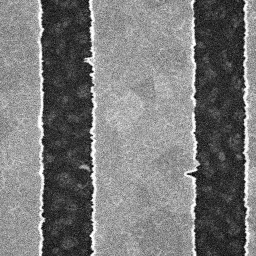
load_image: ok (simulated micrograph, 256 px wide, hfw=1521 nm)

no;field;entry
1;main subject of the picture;one or a few lines or trenches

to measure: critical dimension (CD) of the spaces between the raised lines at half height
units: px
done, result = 50.5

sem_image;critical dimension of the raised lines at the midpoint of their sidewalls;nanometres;608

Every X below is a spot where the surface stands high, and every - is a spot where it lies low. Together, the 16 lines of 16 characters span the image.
XXX---XXXXXX---X
XXX---XXXXXX---X
XXX---XXXXXX---X
XXX---XXXXXX---X
XXX---XXXXXX---X
XXX---XXXXXX---X
XXX---XXXXXX---X
XXX---XXXXXX---X
XXX---XXXXXX---X
XXX---XXXXXX---X
XXX---XXXXXX---X
XXX---XXXXXX---X
XXX---XXXXXX---X
XXX---XXXXXX---X
XXX---XXXXXX---X
XXX---XXXXXX---X